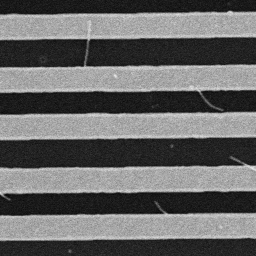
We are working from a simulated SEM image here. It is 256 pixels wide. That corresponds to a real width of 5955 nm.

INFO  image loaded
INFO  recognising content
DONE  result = lines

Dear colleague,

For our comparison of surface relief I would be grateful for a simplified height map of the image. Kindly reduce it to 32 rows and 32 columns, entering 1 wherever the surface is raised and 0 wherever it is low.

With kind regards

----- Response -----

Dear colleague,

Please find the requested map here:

00000000000000000000000000000000
00000000000000000000000000001000
11111111111111111111111111111111
11111111111111111111111111111111
11111111111111111111111111111111
00000000000000000000000000000000
00000000000000000000000000000000
00000000000000000000000000000000
11111111111111111111111111111111
11111111111111111111111111111111
11111111111111111111111111111111
11101000000000000000000000000000
00000000000000000000000000000000
00000000000000000000000000000000
11111111111111111111111111111111
11111111111111111111111111111111
11111111111111111111111111111111
00000000000000000000000000000000
00000000000000000000000000000000
00000000000000000000000000000000
00000000000000000000000000000000
11111111111111111111111111111111
11111111111111111111111111111111
11111111111111111111111111111111
00000000000000000000000000000000
00000000000000000000000000000000
00000000000000000000000000000000
11111111111111111111111111111111
11111111111111111111111111111111
11111111111111111111111111111111
00000000000000000000000000000000
00000000000000000000000000000000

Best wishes